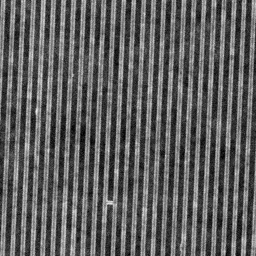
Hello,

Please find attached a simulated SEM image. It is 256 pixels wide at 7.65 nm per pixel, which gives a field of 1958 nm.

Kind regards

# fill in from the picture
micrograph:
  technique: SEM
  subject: parallel lines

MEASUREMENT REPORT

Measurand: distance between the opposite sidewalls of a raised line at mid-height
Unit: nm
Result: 24.8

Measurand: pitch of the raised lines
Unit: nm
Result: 76.7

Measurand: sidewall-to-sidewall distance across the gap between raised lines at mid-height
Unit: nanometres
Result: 52.5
